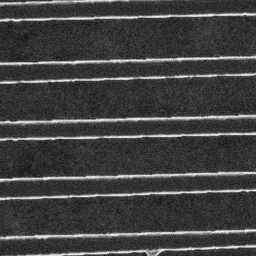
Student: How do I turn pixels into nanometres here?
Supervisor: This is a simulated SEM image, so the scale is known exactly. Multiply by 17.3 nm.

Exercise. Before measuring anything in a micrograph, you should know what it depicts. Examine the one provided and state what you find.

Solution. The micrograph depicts lines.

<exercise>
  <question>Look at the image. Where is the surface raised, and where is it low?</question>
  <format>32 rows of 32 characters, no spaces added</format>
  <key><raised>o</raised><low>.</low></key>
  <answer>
.ooooooooooooooooooooooooooooooo
oooooooooooooooooooooooooooooooo
o...............................
................................
................................
................................
................................
....................oooooooooooo
oooooooooooooooooooooooooooooooo
ooooooooooooooooooooooo.........
................................
................................
................................
................................
................................
oooooooooooooooooooooooooooooooo
oooooooooooooooooooooooooooooooo
................................
................................
................................
................................
................................
oooooooooooooooooooooooooooooooo
oooooooooooooooooooooooooooooooo
oooooooooooo....................
................................
................................
................................
................................
......oooooooooooooooooooooooooo
oooooooooooooooooooooooooooooooo
oooooooooooooooo..oo............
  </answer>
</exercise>